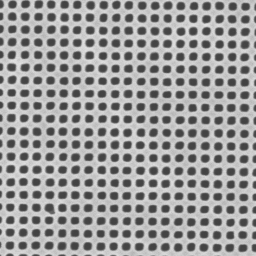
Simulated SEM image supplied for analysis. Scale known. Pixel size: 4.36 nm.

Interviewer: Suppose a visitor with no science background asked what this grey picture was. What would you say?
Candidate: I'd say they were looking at a regular array of holes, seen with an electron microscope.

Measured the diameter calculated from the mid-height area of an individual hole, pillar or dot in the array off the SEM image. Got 36.8 nm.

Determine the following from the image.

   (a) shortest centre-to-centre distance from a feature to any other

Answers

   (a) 0.0539 microns